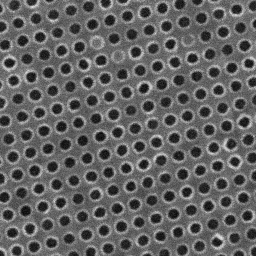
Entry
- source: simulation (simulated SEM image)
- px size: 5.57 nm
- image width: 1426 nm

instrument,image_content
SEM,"a regular array of holes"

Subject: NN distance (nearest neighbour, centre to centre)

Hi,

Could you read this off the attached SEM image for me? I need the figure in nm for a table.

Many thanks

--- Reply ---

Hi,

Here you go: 99.2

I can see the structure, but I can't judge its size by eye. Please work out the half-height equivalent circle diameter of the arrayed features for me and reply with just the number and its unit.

64.7 nm